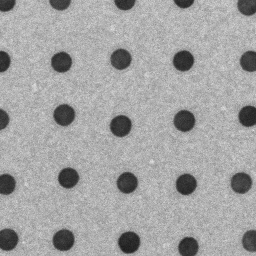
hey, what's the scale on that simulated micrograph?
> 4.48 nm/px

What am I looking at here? a regular array of holes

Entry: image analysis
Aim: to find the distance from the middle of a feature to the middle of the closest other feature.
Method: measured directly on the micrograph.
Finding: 261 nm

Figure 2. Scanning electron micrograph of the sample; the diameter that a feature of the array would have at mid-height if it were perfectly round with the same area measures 98.5 nm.